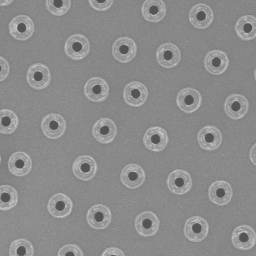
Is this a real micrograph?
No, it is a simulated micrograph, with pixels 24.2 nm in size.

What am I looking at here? a regular array of ring-shaped raised bodies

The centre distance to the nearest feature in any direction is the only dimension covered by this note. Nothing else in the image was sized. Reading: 1060 nanometres